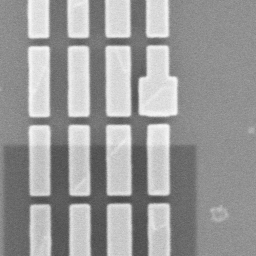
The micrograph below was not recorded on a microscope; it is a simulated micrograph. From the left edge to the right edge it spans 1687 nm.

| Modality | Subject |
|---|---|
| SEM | wiring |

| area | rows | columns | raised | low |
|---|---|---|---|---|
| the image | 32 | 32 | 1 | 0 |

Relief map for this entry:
00001100011001110011100000000000
00001100011001110011100000000000
00001100011001110011100000000000
00001100011001110011100000000000
00001100011000110001100000000000
00000000000000000000000000000000
00001100011001110011100000000000
00001100011001110011100000000000
00001100011001110011100000000000
00001100011001110011100000000000
00001100011001110111110000000000
00001100011001110111110000000000
00001100011001110111110000000000
00001100011001110111110000000000
00000000000000000000000000000000
00000000000000000000000000000000
00001100011001110001100000000000
00001100011001110011100000000000
00001100011001110011100000000000
00001100011001110001100000000000
00001100011001110001100000000000
00001100011001110001100000000000
00001100011001110001100000000000
00001100011001110001100000000000
00000000000000000000000000000000
00000000000000000000000000000000
00001100011001110001100000000000
00001100011001110001100000000000
00001100011001110001100000000000
00001100011001110001100000000000
00001100011001110001100000000000
00001100011001110001100000000000